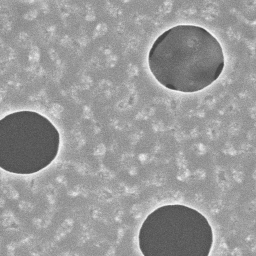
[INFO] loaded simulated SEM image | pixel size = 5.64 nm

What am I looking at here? holes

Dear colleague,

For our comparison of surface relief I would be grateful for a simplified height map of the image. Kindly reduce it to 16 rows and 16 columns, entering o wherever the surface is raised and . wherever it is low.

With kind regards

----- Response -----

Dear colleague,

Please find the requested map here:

oooooooooooooooo
oooooooooooooooo
oooooooooo....oo
ooooooooo.....oo
ooooooooo.....oo
ooooooooooo..ooo
oooooooooooooooo
...ooooooooooooo
....oooooooooooo
....oooooooooooo
...ooooooooooooo
oooooooooooooooo
oooooooooooooooo
ooooooooo....ooo
ooooooooo....ooo
ooooooooo....ooo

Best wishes